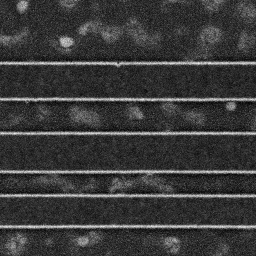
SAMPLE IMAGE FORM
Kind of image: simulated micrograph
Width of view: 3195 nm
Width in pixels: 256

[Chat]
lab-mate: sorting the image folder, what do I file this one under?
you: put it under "one or a few lines or trenches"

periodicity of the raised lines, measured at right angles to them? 0.813 um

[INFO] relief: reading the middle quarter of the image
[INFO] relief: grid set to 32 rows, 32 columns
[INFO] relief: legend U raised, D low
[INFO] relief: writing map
UUUUUUUUUUUUUUUUUUUUUUUUUUUUUUUU
UUUUUUUUUUUUUUUUUUUUUUUUUUUUUUUU
UUUUUUUUUUUUUUUUUUUUUUUUUUUUUUUU
UUUUUUUUUUUUUUUUUUUUUUUUUUUUUUUU
UUUUUUUUUUUUUUUUUUUUUUUUUUUUUUUU
UUUUUUUUUUUUUUUUUUUUUUUUUUUUUUUU
UUUUUUUUUUUUUUUUUUUUUUUUUUUUUUUU
UUUUUUUUUUUUUUUUUUUUUUUUUUUUUUUU
UUUUUUUUUUUUUUUUUUUUUUUUUUUUUUUU
DDDDDDDDDDDDDDDDDDDDDDDDDDDDDDDD
DDDDDDDDDDDDDDDDDDDDDDDDDDDDDDDD
DDDDDDDDDDDDDDDDDDDDDDDDDDDDDDDD
DDDDDDDDDDDDDDDDDDDDDDDDDDDDDDDD
DDDDDDDDDDDDDDDDDDDDDDDDDDDDDDDD
DDDDDDDDDDDDDDDDDDDDDDDDDDDDDDDD
DDDDDDDDDDDDDDDDDDDDDDDDDDDDDDDD
DDDDDDDDDDDDDDDDDDDDDDDDDDDDDDDD
UUUUUUUUUUUUUUUUUUUUUUUUUUUUUUUU
UUUUUUUUUUUUUUUUUUUUUUUUUUUUUUUU
UUUUUUUUUUUUUUUUUUUUUUUUUUUUUUUU
UUUUUUUUUUUUUUUUUUUUUUUUUUUUUUUU
UUUUUUUUUUUUUUUUUUUUUUUUUUUUUUUU
UUUUUUUUUUUUUUUUUUUUUUUUUUUUUUUU
UUUUUUUUUUUUUUUUUUUUUUUUUUUUUUUU
UUUUUUUUUUUUUUUUUUUUUUUUUUUUUUUU
UUUUUUUUUUUUUUUUUUUUUUUUUUUUUUUU
UUUUUUUUUUUUUUUUUUUUUUUUUUUUUUUU
DDDDDDDDDDDDDDDDDDDDDDDDDDDDDDDD
DDDDDDDDDDDDDDDDDDDDDDDDDDDDDDDD
DDDDDDDDDDDDDDDDDDDDDDDDDDDDDDDD
DDDDDDDDDDDDDDDDDDDDDDDDDDDDDDDD
DDDDDDDDDDDDDDDDDDDDDDDDDDDDDDDD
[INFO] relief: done